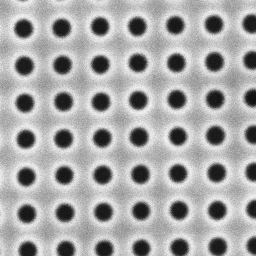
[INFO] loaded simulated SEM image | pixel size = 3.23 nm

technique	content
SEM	a regular array of holes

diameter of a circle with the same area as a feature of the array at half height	0.0651	um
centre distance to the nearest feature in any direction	119	nm